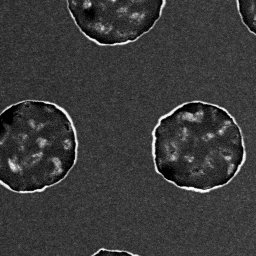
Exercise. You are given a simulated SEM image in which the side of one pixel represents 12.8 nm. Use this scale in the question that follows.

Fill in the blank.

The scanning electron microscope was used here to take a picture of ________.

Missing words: holes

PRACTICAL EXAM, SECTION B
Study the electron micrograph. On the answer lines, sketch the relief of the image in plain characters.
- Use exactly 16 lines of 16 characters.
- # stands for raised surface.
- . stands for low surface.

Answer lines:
####......#####.
#####.....#####.
######..########
################
################
################
#..#########.###
....######.....#
.....#####.....#
.....#####.....#
....######.....#
...########...##
################
################
################
################